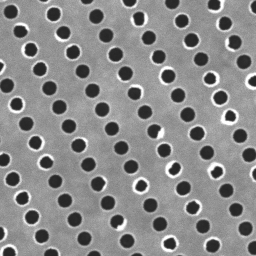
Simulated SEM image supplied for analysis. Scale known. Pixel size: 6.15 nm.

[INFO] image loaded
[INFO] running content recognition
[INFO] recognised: a regular array of holes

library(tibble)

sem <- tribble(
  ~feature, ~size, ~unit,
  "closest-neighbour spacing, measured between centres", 131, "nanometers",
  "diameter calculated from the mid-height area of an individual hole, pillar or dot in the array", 88.6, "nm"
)